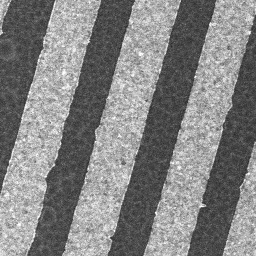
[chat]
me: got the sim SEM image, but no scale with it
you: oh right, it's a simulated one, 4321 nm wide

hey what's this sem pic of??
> one or a few lines or trenches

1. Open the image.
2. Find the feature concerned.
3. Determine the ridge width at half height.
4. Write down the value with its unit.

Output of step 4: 722 nm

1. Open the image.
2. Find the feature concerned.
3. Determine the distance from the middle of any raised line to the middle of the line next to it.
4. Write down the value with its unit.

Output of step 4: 1300 nanometers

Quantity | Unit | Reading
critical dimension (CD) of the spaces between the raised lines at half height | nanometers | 599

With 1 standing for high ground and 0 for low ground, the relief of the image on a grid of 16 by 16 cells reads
0001110011100111
0001110011100111
0001110011100110
0001100111000110
0011100111001110
0011100111001110
0011000110001100
0111001110011100
0111001110011100
0111001110011000
0110001100011000
1110011100111001
1110011100111001
1110011000110001
1100111001110011
1100111001110011